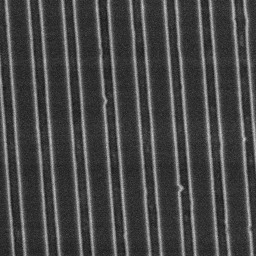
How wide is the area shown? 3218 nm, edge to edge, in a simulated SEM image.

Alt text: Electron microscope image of parallel lines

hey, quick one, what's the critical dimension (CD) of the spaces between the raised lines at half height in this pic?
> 136 nm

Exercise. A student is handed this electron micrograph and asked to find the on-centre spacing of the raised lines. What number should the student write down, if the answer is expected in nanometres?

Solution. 427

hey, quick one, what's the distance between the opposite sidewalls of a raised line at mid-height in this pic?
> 0.296 microns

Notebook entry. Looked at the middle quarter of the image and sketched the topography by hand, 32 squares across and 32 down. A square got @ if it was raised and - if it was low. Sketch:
@---@@@@@---@@@@@@---@@@@@@--@@@
@---@@@@@---@@@@@@---@@@@@@--@@@
@---@@@@@@--@@@@@@---@@@@@@--@@@
@---@@@@@@--@@@@@@---@@@@@@--@@@
@---@@@@@@--@@@@@@---@@@@@@---@@
@---@@@@@@---@@@@@---@@@@@@---@@
@---@@@@@@---@@@@@---@@@@@@---@@
@---@@@@@@---@@@@@---@@@@@@---@@
@---@@@@@@---@@@@@---@@@@@@---@@
@---@@@@@@---@@@@@@--@@@@@@---@@
@@--@@@@@@---@@@@@@---@@@@@---@@
@@---@@@@@---@@@@@@---@@@@@---@@
@@---@@@@@---@@@@@@---@@@@@---@@
@@---@@@@@---@@@@@@---@@@@@---@@
@@---@@@@@---@@@@@@---@@@@@---@@
@@---@@@@@@--@@@@@@---@@@@@---@@
@@---@@@@@@--@@@@@@---@@@@@@--@@
@@---@@@@@@--@@@@@@---@@@@@@---@
@@---@@@@@@---@@@@@---@@@@@@---@
@@---@@@@@@---@@@@@---@@@@@@---@
@@---@@@@@@---@@@@@---@@@@@@---@
@@---@@@@@@---@@@@@---@@@@@@---@
@@---@@@@@@---@@@@@@--@@@@@@---@
@@@--@@@@@@---@@@@@@---@@@@@---@
@@@---@@@@@---@@@@@@--@@@@@@---@
@@@---@@@@@---@@@@@@--@@@@@@---@
@@@---@@@@@---@@@@@@---@@@@@---@
@@@---@@@@@---@@@@@@---@@@@@@--@
@@@---@@@@@@--@@@@@@---@@@@@@--@
@@@---@@@@@@--@@@@@@---@@@@@@--@
@@@---@@@@@@--@@@@@@---@@@@@@---
@@@---@@@@@@--@@@@@@---@@@@@@---